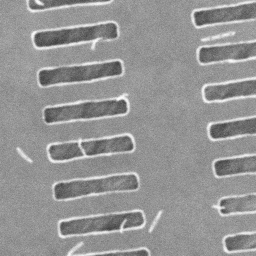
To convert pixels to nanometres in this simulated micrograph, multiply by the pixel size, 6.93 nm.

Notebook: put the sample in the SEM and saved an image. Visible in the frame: holes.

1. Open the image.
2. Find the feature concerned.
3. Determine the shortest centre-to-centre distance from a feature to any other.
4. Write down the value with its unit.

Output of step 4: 263 nanometers